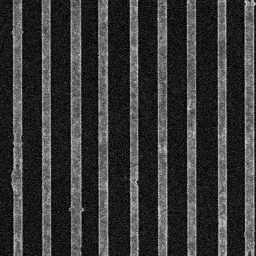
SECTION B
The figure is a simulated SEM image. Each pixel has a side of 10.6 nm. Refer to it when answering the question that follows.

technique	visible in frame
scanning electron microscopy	parallel lines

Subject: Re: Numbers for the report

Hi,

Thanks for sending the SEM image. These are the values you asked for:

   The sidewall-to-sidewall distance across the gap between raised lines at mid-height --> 214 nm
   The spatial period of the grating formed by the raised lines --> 306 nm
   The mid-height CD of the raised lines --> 91.2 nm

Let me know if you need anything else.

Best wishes